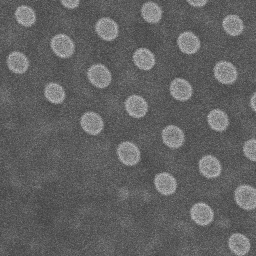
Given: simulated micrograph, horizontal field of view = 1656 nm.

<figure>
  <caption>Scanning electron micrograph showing a regular array of raised bodies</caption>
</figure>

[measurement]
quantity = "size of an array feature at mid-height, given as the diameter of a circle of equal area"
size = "20.6 pixels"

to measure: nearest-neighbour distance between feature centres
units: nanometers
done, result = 307